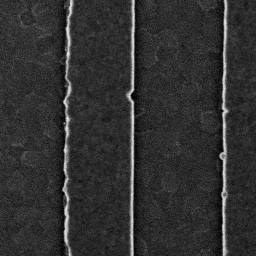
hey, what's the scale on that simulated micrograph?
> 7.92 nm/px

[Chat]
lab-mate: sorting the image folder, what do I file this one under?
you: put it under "one or a few lines or trenches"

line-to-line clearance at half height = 0.724 microns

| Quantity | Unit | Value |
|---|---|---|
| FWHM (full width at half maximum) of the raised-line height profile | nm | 524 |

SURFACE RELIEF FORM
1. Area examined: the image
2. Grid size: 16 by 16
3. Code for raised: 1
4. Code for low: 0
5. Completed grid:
0000111100000011
0000111100000011
0000111100000011
0000111100000011
0000111100000011
0000111100000011
0000111100000011
0000111100000011
0000111100000011
0000111100000011
0000111100000011
0000111100000011
0000111100000011
0000111100000011
0000111100000011
0000111100000011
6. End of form